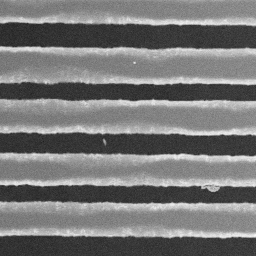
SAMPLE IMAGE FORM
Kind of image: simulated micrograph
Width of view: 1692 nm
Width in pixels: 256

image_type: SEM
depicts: lines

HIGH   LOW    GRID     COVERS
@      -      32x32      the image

@@@@@@@@@@@@@@@@@@@@@@@@@@@@@@@@
@@@@@@@@@@@@@@@@@@@@@@@@@@@@@@@@
@@@@@@@-@----@@@@@@@@@@@@@@@@@@@
--------------------------------
--------------------------------
--------------------------------
@@@@@@@@@@@@@@@@@@---@@@@@@@@@@@
@@@@@@@@@@@@@@@@@@@@@@@@@@@@@@@@
@@@@@@@@@@@@@@@@@@@@@@@@@@@@@@@@
@@@@@@@@@@@@@@@@@@@@@@@@@@@@@@@@
--------------------------------
--------------------------------
--------------------------------
@@@@@@@@@@@@@@@@@@@@@@@@@@@@@@@@
@@@@@@@@@@@@@@@@@@@@@@@@@@@@@@@@
@@@@@@@@@@@@@@@@@@@@@@@@@@@@@@@@
----------------------@@@@@@@@@@
--------------------------------
--------------------------------
@@@@@@@-------------@@@@--------
@@@@@@@@@@@@@@@@@@@@@@@@@@@@@@@@
@@@@@@@@@@@@@@@@@@@@@@@@@@@@@@@@
@@@@@@@@@@@@@@@@@@@@@@@@@@@@@@@@
--------------------------------
--------------------------------
--------------------------------
@@@@@@@@@@@@@@@@@@@@@@@@@@@@@@@@
@@@@@@@@@@@@@@@@@@@@@@@@@@@@@@@@
@@@@@@@@@@@@@@@@@@@@@@@@@@@@@@@@
---------------------------@@--@
--------------------------------
--------------------------------